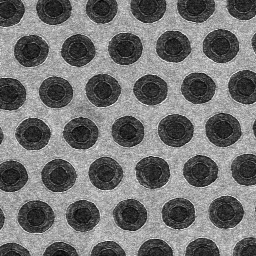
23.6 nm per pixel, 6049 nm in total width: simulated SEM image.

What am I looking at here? a regular array of ring-shaped grooves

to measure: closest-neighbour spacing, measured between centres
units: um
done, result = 1.11